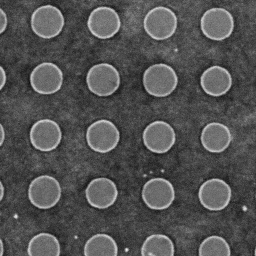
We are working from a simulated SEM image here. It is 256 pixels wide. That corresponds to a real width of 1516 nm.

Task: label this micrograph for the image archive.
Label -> a regular array of raised bodies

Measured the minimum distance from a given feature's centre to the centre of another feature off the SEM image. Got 334 nanometers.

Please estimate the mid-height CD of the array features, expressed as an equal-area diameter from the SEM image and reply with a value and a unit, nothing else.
30.7 pixels